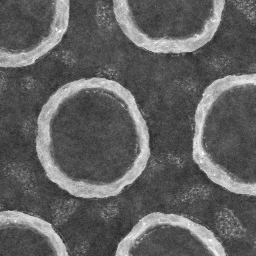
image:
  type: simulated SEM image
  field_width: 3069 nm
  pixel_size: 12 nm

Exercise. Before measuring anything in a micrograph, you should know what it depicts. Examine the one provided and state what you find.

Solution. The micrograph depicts raised bodies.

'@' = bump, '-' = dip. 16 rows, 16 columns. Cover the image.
@@@@----@@@@@@--
@@@@----@@@@@---
@@@------@@@----
@@--------------
----------------
-----@@-------@@
---@@@@@-----@@@
---@@@@@@----@@@
---@@@@@@---@@@@
---@@@@@@---@@@@
---@@@@@@----@@@
----@@@@------@@
----------------
----------------
@@@------@@@----
@@@@----@@@@@---